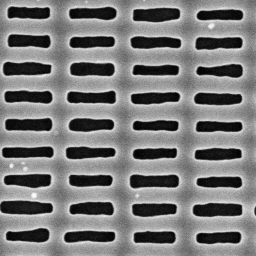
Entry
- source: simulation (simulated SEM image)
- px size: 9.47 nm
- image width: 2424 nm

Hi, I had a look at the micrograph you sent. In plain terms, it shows a regular array of holes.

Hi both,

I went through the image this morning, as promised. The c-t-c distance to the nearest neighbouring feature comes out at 0.263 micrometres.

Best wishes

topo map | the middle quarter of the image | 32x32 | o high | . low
oo..........oooooo..........oooo
o............oooo............ooo
oo..........ooooo...........oooo
oooooooooooooooooooooooooooooooo
oooooooooooooooooooooooooooooooo
oooooooooooooooooooooooooooooooo
oooooooooooooooooooooooooooooooo
o............oooo............ooo
o............ooo.............ooo
o............oooo...........oooo
oooooooooooooooooooooooooooooooo
oooooooooooooooooooooooooooooooo
oooooooooooooooooooooooooooooooo
oooo..oooooooooooooooooooooooooo
o............oooo...........oooo
o............oooo............ooo
oo..........oooooo..........oooo
oooooooooooooooooooooooooooooooo
oooooooooooooooooooooooooooooooo
oooooooooooooooooooooooooooooooo
oooo.ooooooooooooooooooooooooooo
o............ooooo..........oooo
.............oooo...........oooo
o.......oooooooooo..........oooo
oooooooooooooooooooooooooooooooo
oooooooooooooooooooooooooooooooo
oooooooooooooooooooooooooooooooo
oooooooooooooooooooooooooo.ooooo
o...........ooooo............ooo
o...........oooo.............ooo
oo.........ooooo............oooo
oooooooooooooooooooooooooooooooo